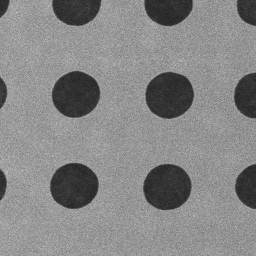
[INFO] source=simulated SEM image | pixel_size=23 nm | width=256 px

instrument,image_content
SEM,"holes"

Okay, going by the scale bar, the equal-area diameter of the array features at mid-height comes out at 1090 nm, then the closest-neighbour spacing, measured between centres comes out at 2110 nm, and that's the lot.